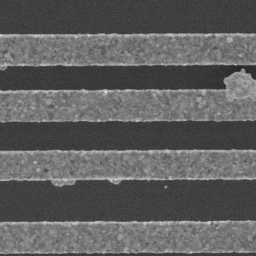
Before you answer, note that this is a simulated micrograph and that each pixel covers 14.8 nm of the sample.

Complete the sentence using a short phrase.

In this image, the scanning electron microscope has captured lines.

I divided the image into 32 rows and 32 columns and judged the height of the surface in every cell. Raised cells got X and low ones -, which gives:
--------------------------------
--------------------------------
--------------------------------
--------------------------------
XXXXXXXXXXXXXXXXXXXXXXXXXXXXXXXX
XXXXXXXXXXXXXXXXXXXXXXXXXXXXXXXX
XXXXXXXXXXXXXXXXXXXXXXXXXXXXXXXX
XXXXXXXXXXXXXXXXXXXXXXXXXXXXXXXX
--------------------------------
-----------------------------XX-
----------------------------XXXX
XXXXXXXXXXXXXXXXXXXXXXXXXXXXXXXX
XXXXXXXXXXXXXXXXXXXXXXXXXXXXXXXX
XXXXXXXXXXXXXXXXXXXXXXXXXXXXXXXX
XXXXXXXXXXXXXXXXXXXXXXXXXXXXXXXX
--------------------------------
--------------------------------
--------------------------------
--------------------------------
XXXXXXXXXXXXXXXXXXXXXXXXXXXXXXXX
XXXXXXXXXXXXXXXXXXXXXXXXXXXXXXXX
XXXXXXXXXXXXXXXXXXXXXXXXXXXXXXXX
X----X--X-----------------------
--------------------------------
--------------------------------
--------------------------------
--------------------------------
--------------------------------
XXXXXXXXXXXXXXXXXXXXXXXXXXXXXXXX
XXXXXXXXXXXXXXXXXXXXXXXXXXXXXXXX
XXXXXXXXXXXXXXXXXXXXXXXXXXXXXXXX
XXXXXXXXXXXXXXXXXXXXXXXXXXXXXXXX